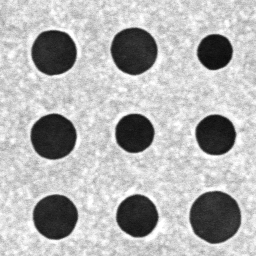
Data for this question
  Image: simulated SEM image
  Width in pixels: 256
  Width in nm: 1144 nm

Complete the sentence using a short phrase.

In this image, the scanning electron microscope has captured a regular array of holes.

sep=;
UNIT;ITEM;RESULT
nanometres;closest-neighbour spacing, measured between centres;358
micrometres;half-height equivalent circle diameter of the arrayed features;0.206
